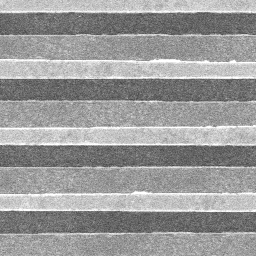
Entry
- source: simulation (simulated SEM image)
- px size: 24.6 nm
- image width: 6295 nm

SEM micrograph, lines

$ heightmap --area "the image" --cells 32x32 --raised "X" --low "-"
XXXXXXXXXXXXXXXXXXXXXXXXXXXXXXXX
--------------------------------
--------------------------------
--------------------------------
XXXXXXXXXXXXXXXXXXXXXXXXXXXXXXXX
XXXXXXXXXXXXXXXXXXXXXXXXXXXXXXXX
XXXXXXXXXXXXXXXXXXXXXXXXXXXXXXXX
XXXXXXXXXXXXXXXXXXXXXXXXXXXXXXXX
XXXXXXXXXXXXXXXXXXXXXXXXXXXXXXXX
XXXXXXXXXXXXXXXXXXXXXXXXXXXXXXXX
--------------------------------
--------------------------------
--------------------------------
XXXXXXXXXXXXXXXXXXXXXXXXXXXXXXXX
XXXXXXXXXXXXXXXXXXXXXXXXXXXXXXXX
XXXXXXXXXXXXXXXXXXXXXXXXXXXXXXXX
XXXXXXXXXXXXXXXXXXXXXXXXXXXXXXXX
XXXXXXXXXXXXXXXXXXXXXXXXXXXXXXXX
--------------------------------
--------------------------------
--------------------------------
XXXXXXXXXXXXXXXXXXXXXXXXXXXXXXXX
XXXXXXXXXXXXXXXXXXXXXXXXXXXXXXXX
XXXXXXXXXXXXXXXXXXXXXXXXXXXXXXXX
XXXXXXXXXXXXXXXXXXXXXXXXXXXXXXXX
XXXXXXXXXXXXXXXXXXXXXXXXXXXXXXXX
--------------------------------
--------------------------------
--------------------------------
XXXXXXXXXXXXXXXXXXXXXXXXXXXXXXXX
XXXXXXXXXXXXXXXXXXXXXXXXXXXXXXXX
XXXXXXXXXXXXXXXXXXXXXXXXXXXXXXXX